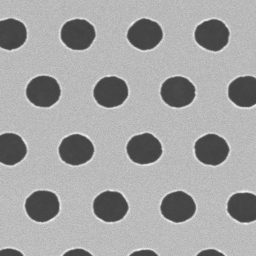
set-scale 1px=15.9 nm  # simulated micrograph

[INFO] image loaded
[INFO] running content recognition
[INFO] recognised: a regular array of holes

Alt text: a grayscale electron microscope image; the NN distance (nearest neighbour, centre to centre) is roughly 1050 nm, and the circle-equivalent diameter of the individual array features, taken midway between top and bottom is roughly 535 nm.